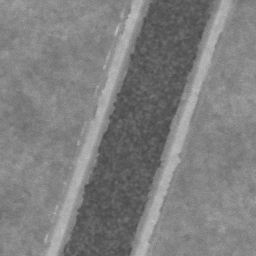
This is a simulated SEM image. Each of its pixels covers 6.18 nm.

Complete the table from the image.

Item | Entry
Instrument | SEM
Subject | one or a few lines or trenches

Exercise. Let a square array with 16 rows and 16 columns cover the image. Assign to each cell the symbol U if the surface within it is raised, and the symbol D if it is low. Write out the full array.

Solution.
UUUUUUUUDDDDDDUU
UUUUUUUUDDDDDDUU
UUUUUUUUDDDDDUUU
UUUUUUUDDDDDDUUU
UUUUUUUDDDDDDUUU
UUUUUUUDDDDDUUUU
UUUUUUDDDDDDUUUU
UUUUUUDDDDDDUUUU
UUUUUUDDDDDUUUUU
UUUUUDDDDDDUUUUU
UUUUUDDDDDDUUUUU
UUUUUDDDDDUUUUUU
UUUUDDDDDDUUUUUU
UUUUDDDDDDUUUUUU
UUUUDDDDDUUUUUUU
UUUDDDDDDUUUUUUU